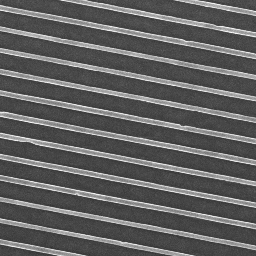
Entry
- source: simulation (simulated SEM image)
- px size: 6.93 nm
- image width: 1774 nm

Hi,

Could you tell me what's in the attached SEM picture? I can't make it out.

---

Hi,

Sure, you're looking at parallel lines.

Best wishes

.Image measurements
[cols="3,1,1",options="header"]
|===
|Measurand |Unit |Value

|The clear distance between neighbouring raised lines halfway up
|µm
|0.116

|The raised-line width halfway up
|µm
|0.029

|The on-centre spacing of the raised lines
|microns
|0.145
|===